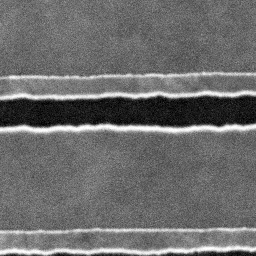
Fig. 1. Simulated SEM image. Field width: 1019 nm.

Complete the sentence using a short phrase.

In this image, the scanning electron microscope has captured lines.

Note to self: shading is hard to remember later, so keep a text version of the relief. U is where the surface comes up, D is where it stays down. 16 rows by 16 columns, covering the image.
UUUUUUUUUUUUUUUU
UUUUUUUUUUUUUUUU
UUUUUUUUUUUUUUUU
UUUUUUUUUUUUUUUU
UUUUUUUUUUUUUUUU
UUUUUUUUUUUUUUUU
DDDDDDDDDDDDDDDD
DDDDDDDDDDDDDDDD
UUUUUUUUUUUUUUUU
UUUUUUUUUUUUUUUU
UUUUUUUUUUUUUUUU
UUUUUUUUUUUUUUUU
UUUUUUUUUUUUUUUU
UUUUUUUUUUUUUUUU
UUUUUUUUUUUUUUUU
UUUUUUUUUUUUUUUU